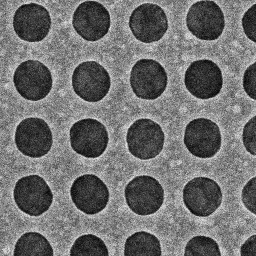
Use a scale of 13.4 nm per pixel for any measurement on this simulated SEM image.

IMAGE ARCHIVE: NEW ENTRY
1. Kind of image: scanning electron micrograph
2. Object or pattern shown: a regular array of holes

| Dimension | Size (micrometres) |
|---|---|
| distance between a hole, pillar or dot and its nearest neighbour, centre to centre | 0.753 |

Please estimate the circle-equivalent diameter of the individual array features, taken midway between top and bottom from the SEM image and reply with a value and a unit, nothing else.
0.535 um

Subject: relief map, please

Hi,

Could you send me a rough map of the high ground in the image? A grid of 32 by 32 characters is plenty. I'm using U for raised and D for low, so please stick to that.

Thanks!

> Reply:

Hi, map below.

UUUDDUUUUUDDDUUUUUDUUUUUDDDUUUUU
UUDDDDUUUDDDDDUUUDDDDUUDDDDDUUUD
UUDDDDUUUDDDDDUUDDDDDUUDDDDDUUDD
UUDDDDUUUDDDDDUUDDDDDUUDDDDDUUDD
UUDDDDUUUUDDDUUUUDDDUUUUDDDUUUUD
UUUUUUUUUUUUUUUUUUUUUUUUUUUUUUUU
UUUUUUUUUUUUUUUUUUUUUUUUUUUUUUUU
UUUUUUUUUUUUUUUUUDDUUUUUUDUUUUUU
UUDDDDUUUDDDDUUUUDDDUUUDDDDUUUUD
UUDDDDUUUDDDDDUUDDDDDUUDDDDDUUDD
UUDDDDDUUDDDDDUUDDDDDUUDDDDDUUDD
UUDDDDUUUDDDDDUUUDDDUUUUDDDUUUUD
UUUUDUUUUUUDDUUUUUDUUUUUUUUUUUUU
UUUUUUUUUUUUUUUUUUUUUUUUUUUUUUUU
UUUUUUUUUUUUUUUUUUUUUUUUUUUUUUUU
UUDDDDUUUDDDDUUUDDDDUUUDDDDUUUUD
UUDDDDUUUDDDDUUUDDDDUUUDDDDDUUDD
UUDDDDDUUDDDDDUUDDDDDUUDDDDDUUDD
UUDDDDUUUDDDDUUUDDDDUUUDDDDDUUUD
UUUUDUUUUUDDDUUUUDDDUUUUDDDUUUUU
UUUUUUUUUUUUUUUUUUUUUUUUUUUUUUUU
UUUUUUUUUUUUUUUUUUUUUUUUUUUUUUUU
UUDDDDUUUDDDDUUUDDDDUUUUDDDUUUUD
UUDDDDUUUDDDDUUUDDDDUUUDDDDDUUDD
UUDDDDDUUDDDDDUUDDDDDUUDDDDDUUDD
UUDDDDUUUDDDDUUUDDDDUUUDDDDDUUDD
UUUDDDUUUUDDUUUUUDDUUUUUDDDUUUUD
UUUUUUUUUUUUUUUUUUUUUUUUUUUUUUUU
UUUUUUUUUUUUUUUUUUUUUUUUUUUUUUUU
UUUDDUUUUUDDUUUUDDDUUUUUDDUUUUUU
UUDDDDUUUDDDDUUUDDDDUUUDDDDUUUDD
UUDDDDDUUDDDDDUDDDDDUUUDDDDDUUDD